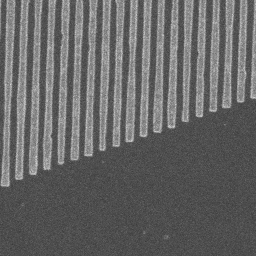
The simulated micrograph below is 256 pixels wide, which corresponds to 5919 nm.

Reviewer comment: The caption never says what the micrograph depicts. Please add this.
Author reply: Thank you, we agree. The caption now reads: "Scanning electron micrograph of parallel lines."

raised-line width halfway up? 136 nm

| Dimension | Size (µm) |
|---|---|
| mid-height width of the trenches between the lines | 0.182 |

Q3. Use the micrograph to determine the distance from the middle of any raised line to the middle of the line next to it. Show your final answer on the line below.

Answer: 13.7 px